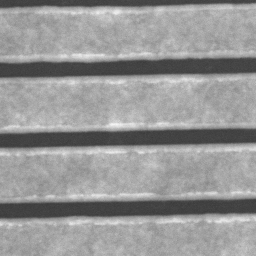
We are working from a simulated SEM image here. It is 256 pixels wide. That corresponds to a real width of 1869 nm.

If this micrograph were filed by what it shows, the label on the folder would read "one or a few lines or trenches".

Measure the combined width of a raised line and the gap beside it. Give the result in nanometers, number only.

512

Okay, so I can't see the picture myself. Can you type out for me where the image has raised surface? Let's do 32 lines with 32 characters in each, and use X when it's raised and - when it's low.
--------------------------------
XXXXXXXXXXXXXXXXXXXXXXXXXXXXXXXX
XXXXXXXXXXXXXXXXXXXXXXXXXXXXXXXX
XXXXXXXXXXXXXXXXXXXXXXXXXXXXXXXX
XXXXXXXXXXXXXXXXXXXXXXXXXXXXXXXX
XXXXXXXXXXXXXXXXXXXXXXXXXXXXXXXX
XXXXXXXXXXXXXXXXXXXXXXXXXXXXXXXX
--------------------------------
--------------------------------
-------------------------------X
XXXXXXXXXXXXXXXXXXXXXXXXXXXXXXXX
XXXXXXXXXXXXXXXXXXXXXXXXXXXXXXXX
XXXXXXXXXXXXXXXXXXXXXXXXXXXXXXXX
XXXXXXXXXXXXXXXXXXXXXXXXXXXXXXXX
XXXXXXXXXXXXXXXXXXXXXXXXXXXXXXXX
XXXXXXXXXXXXXXXXXXXXXXXXXXXXXXXX
--------------------------------
--------------------------------
--------------------XXXXXXXXXXXX
XXXXXXXXXXXXXXXXXXXXXXXXXXXXXXXX
XXXXXXXXXXXXXXXXXXXXXXXXXXXXXXXX
XXXXXXXXXXXXXXXXXXXXXXXXXXXXXXXX
XXXXXXXXXXXXXXXXXXXXXXXXXXXXXXXX
XXXXXXXXXXXXXXXXXXXXXXXXXXXXXXXX
XXXXXXXXXXXXXXXXXXXXXXXXXXXXXXXX
--------------------------------
--------------------------------
---------XXXXX-XXXXXXXXXXXXXXXXX
XXXXXXXXXXXXXXXXXXXXXXXXXXXXXXXX
XXXXXXXXXXXXXXXXXXXXXXXXXXXXXXXX
XXXXXXXXXXXXXXXXXXXXXXXXXXXXXXXX
XXXXXXXXXXXXXXXXXXXXXXXXXXXXXXXX